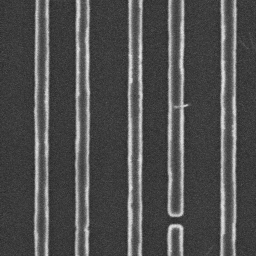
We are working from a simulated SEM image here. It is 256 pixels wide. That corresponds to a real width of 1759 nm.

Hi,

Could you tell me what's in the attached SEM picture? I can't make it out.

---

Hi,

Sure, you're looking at parallel lines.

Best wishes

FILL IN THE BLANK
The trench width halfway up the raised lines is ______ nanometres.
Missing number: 233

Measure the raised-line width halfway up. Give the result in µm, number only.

0.0884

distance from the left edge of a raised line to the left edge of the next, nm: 320